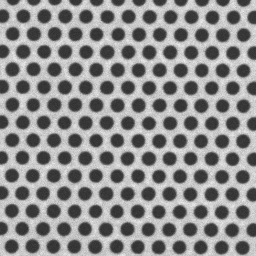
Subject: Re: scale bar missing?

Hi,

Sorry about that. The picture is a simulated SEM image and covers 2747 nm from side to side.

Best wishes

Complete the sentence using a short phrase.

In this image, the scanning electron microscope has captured a regular array of holes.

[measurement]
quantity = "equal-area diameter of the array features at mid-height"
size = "143 nm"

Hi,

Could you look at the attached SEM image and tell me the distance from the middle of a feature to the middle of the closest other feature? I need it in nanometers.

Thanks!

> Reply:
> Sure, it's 218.